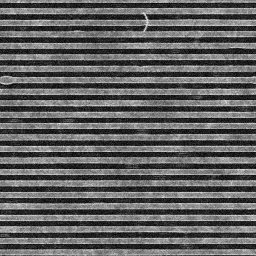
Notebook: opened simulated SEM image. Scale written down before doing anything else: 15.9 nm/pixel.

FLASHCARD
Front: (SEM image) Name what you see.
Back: parallel lines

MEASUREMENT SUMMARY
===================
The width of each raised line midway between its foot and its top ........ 0.0895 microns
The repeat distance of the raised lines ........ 11.5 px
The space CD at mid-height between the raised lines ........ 99.4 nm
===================